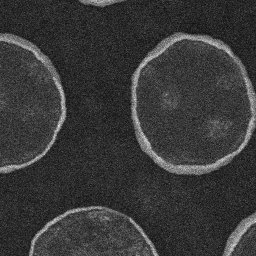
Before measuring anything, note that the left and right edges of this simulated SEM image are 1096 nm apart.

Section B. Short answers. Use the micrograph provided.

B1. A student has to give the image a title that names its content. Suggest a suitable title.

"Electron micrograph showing raised bodies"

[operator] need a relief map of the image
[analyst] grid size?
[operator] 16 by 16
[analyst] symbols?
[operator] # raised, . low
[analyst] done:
................
................
#..........##...
###......######.
###......######.
####....########
####....########
####....########
####.....#######
###......######.
#..........##...
................
................
................
...............#
..............##